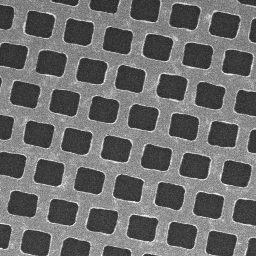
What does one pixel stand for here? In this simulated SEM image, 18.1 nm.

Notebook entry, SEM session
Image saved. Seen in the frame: a regular array of holes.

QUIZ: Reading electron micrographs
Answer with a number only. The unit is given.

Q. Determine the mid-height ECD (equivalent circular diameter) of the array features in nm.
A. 530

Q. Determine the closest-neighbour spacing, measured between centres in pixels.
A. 39.8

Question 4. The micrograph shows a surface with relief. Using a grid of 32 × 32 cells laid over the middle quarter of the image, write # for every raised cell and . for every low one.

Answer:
####.......###..##############..
###........##.......############
###........##.......####.#######
###.......###.......####......##
#####.....###.......###........#
#############.......###........#
##############......###.......##
....###################.......##
....###...##############......##
....###.......##################
....###.......###...############
...###........##.......#########
...###........##........###....#
######.......###.......####.....
#########....###.......####.....
################.......###......
....###############...####......
.......###################......
.......###.....##############...
.......###.......###############
.......###.......###....########
......###........###.......#####
###...###........###.......###..
##########......###........###..
#############...###........##...
###################.......###...
###.....###############...###...
###.......###################...
###.......###......#############
###.......###.......############
##........###.......###.......##
###.......##........###.......##